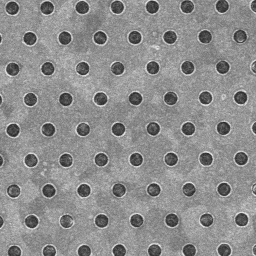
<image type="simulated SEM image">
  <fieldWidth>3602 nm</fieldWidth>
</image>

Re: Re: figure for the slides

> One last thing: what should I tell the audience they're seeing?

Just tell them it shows a regular array of holes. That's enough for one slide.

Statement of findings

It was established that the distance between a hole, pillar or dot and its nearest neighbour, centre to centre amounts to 490 nm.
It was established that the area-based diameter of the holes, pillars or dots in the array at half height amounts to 192 nm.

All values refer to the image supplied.